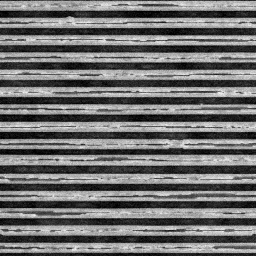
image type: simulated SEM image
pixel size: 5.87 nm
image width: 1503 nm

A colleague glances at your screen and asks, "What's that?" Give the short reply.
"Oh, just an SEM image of parallel lines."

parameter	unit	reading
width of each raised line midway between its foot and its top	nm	46.2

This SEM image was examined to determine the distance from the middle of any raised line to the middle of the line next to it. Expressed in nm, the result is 102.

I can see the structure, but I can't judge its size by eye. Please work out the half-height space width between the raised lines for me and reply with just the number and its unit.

56.5 nanometres